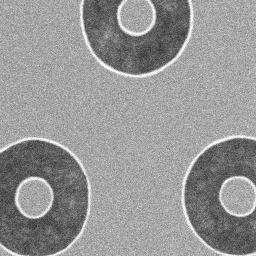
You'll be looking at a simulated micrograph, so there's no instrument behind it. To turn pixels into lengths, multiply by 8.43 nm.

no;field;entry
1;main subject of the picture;ring-shaped grooves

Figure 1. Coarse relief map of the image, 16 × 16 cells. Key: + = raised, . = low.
+++++..+++..++++
+++++...++..++++
+++++.......++++
++++++.....+++++
+++++++...++++++
++++++++++++++++
++++++++++++++++
++++++++++++++++
++++++++++++++++
....+++++++++...
.....+++++++....
.++..+++++++..++
.++...+++++...++
..+..+++++++....
.....+++++++....
....+++++++++...